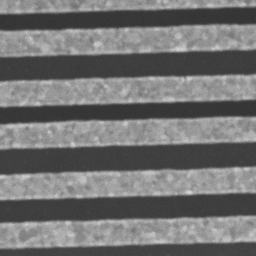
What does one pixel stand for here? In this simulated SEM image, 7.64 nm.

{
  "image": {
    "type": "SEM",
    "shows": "lines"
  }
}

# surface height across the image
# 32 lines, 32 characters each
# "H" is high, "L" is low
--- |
HHHHHHHHHHHHHHHHHHHHHHHHHHHHHHHH
HHHHHHHLLLLLLLLLLLLLLLLLLLLLLLLL
LLLLLLLLLLLLLLLLLLLLLLLLLLLLLLLL
LLLLLLLLLLLLLLLLHHHHHHHHHHHHHHHH
HHHHHHHHHHHHHHHHHHHHHHHHHHHHHHHH
HHHHHHHHHHHHHHHHHHHHHHHHHHHHHHHH
HHHHHHHHHHHHHHHHHHHHLLLLLLLLLLLL
LLLLLLLLLLLLLLLLLLLLLLLLLLLLLLLL
LLLLLLLLLLLLLLLLLLLLLLLLLLLLLLLL
LLLLLLLLLLLLLLLLLLLLLLLLLLLLHHHH
HHHHHHHHHHHHHHHHHHHHHHHHHHHHHHHH
HHHHHHHHHHHHHHHHHHHHHHHHHHHHHHHH
HHHHHHHHHHHHHHHHHHHHHHHHHHHHHHLL
LLLLLLLLLLLLLLLLLLLLLLLLLLLLLLLL
LLLLLLLLLLLLLLLLLLLLLLLLLLLLLLLL
LHHHHHHHHHHHHHHHHHHHHHHHHHHHHHHH
HHHHHHHHHHHHHHHHHHHHHHHHHHHHHHHH
HHHHHHHHHHHHHHHHHHHHHHHHHHHHHHHH
HHHHHHLLLLLLLLLLLLLLLLLLLLLLLLLL
LLLLLLLLLLLLLLLLLLLLLLLLLLLLLLLL
LLLLLLLLLLLLLLLLLLLLLLLLLLLLLLLL
LLLLLLLLLLLLHHHHHHHHHHHHHHHHHHHH
HHHHHHHHHHHHHHHHHHHHHHHHHHHHHHHH
HHHHHHHHHHHHHHHHHHHHHHHHHHHHHHHH
HHHHHHHHHHHHHHHLLLLLLLLLLLLLLLLL
LLLLLLLLLLLLLLLLLLLLLLLLLLLLLLLL
LLLLLLLLLLLLLLLLLLLLLLLLLLLLLLLL
LLLLLLLLLLLLLLLHHLLHHHHHHHHHHHHH
HHHHHHHHHHHHHHHHHHHHHHHHHHHHHHHH
HHHHHHHHHHHHHHHHHHHHHHHHHHHHHHHH
HHHHHHHHHHHHHHHHHHLLLLLLLLLLLLLL
LLLLLLLLLLLLLLLLLLLLLLLLLLLLLLLL